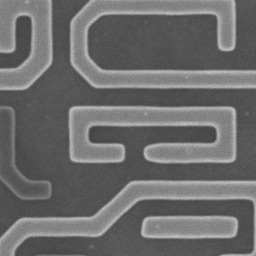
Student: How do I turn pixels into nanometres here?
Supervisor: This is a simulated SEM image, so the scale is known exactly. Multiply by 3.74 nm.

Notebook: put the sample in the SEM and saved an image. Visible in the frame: wiring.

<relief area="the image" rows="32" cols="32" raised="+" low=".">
++++++.....++++++++++++++++++...
++++++....+++++++++++++++++++...
++..++...+++...............++...
++..++...++................++...
++..++...++................++...
++..++...++................++...
++..++...++.....................
...+++...++.....................
..++++...+++....................
+++++.....++++++++++++++++++++++
++++.......+++++++++++++++++++++
................................
................................
+........+++++++++++..+++++++...
++.......++++++++++++++++++++...
++.......++++++++++++++++++++...
++.......++................++...
++.......++................++...
++.......+++++++..+++++++++++...
++.......+++++++..+++++++++++...
++..............................
+++.............................
++++............................
.+++++.........+++++++++++++++++
..++++........++++++++++++++++++
.............++++...............
............++++................
..+++++++++++++...++++++++++++..
.+++++++++++++....++++++++++++..
++++.......+......+++++++++++...
+++.............................
++..............................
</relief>